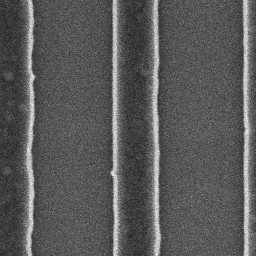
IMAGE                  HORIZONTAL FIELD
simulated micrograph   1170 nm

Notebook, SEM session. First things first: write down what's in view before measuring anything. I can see one or a few lines or trenches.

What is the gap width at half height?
394 nanometres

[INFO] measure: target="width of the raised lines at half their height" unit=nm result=192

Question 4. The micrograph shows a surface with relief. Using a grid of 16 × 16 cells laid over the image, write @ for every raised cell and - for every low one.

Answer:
@@-----@@@-----@
@@-----@@@-----@
@@-----@@@-----@
@@-----@@@-----@
@@-----@@@-----@
@@-----@@@-----@
@@-----@@@-----@
@@-----@@@-----@
@@-----@@@-----@
@@-----@@@-----@
@@-----@@@-----@
@@-----@@@-----@
@@-----@@@-----@
@@-----@@@-----@
@@-----@@@-----@
@@-----@@@-----@